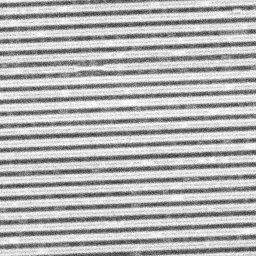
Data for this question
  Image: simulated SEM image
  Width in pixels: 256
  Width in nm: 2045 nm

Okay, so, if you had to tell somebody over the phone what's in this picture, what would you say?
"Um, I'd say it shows parallel lines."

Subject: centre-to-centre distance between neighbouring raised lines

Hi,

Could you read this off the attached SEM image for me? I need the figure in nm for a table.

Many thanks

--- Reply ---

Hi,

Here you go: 96.4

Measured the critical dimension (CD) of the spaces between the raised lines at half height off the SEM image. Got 0.0479 microns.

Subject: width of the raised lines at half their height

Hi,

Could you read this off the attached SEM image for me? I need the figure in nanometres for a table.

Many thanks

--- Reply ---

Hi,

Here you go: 47.9